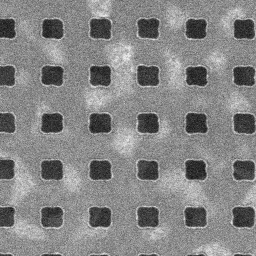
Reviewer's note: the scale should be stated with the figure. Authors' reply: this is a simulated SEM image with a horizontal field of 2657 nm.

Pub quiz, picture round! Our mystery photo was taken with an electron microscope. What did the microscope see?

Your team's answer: a regular array of raised bodies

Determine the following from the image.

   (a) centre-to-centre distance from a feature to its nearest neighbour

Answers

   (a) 487 nm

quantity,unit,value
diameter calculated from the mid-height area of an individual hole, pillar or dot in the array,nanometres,254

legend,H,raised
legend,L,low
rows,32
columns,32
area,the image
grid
LLLLLLLLLLLLLLLLLLLLLLLLLLLLLLLL
LLLLLLLLLLLLLLLLLLLLLLLLLLLLLLLL
HHLLLLHLLLLHHHLLLHHHLLLHHHLLLHHH
HHLLLHHHLLLHHHLLLHHHLLLHHHLLLHHH
HHLLLHHHLLLHHHLLLHHHLLLHHHLLLHHH
LLLLLLLLLLLLLLLLLLLLLLLLLLLLLLLL
LLLLLLLLLLLLLLLLLLLLLLLLLLLLLLLL
LLLLLLLLLLLLLLLLLLLLLLLLLLLLLLLL
HHLLLHHHLLLHHHLLLHHHLLLHHHLLLHHH
HHLLLHHHLLLHHHLLLHHHLLLHHHLLLHHH
HHLLLHHHLLLHHHLLLHHHLLLHHHLLLHHH
LLLLLLLLLLLLLLLLLLLLLLLLLLLLLLLL
LLLLLLLLLLLLLLLLLLLLLLLLLLLLLLLL
LLLLLLLLLLLLLLLLLLLLLLLLLLLLLLLL
HHLLLHHHLLLHHHLLLHHHLLLHHHLLLHHH
HHLLLHHHLLLHHHLLLHHHLLLHHHLLLHHH
HHLLLHHHLLLHHHLLLHHHLLLHHHLLLHHH
LLLLLLLLLLLLLLLLLLLLLLLLLLLLLLLL
LLLLLLLLLLLLLLLLLLLLLLLLLLLLLLLL
LLLLLLLLLLLLLLLLLLLLLLLLLLLLLLLL
HHLLLHHHLLLHHHLLLHHHLLLHHHLLLHHH
HHLLLHHHLLLHHHLLLHHHLLLHHHLLLHHH
LLLLLLHHLLLLHLLLLLLLLLLLHLLLLLHH
LLLLLLLLLLLLLLLLLLLLLLLLLLLLLLLL
LLLLLLLLLLLLLLLLLLLLLLLLLLLLLLLL
LLLLLLLLLLLLLLLLLLLLLLLLLLLLLLLL
HHLLLHHHLLLHHHLLLHHHLLLHHHLLLHHH
HHLLLHHHLLLHHHLLLHHHLLLHHHLLLHHH
LLLLLLLLLLLLLLLLLLLLLLLLLLLLLLLL
LLLLLLLLLLLLLLLLLLLLLLLLLLLLLLLL
LLLLLLLLLLLLLLLLLLLLLLLLLLLLLLLL
LLLLLLLLLLLLLLLLLLLLLLLLLLLLLLLL